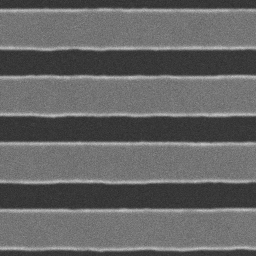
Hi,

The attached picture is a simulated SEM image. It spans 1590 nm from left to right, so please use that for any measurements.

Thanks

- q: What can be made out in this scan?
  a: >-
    lines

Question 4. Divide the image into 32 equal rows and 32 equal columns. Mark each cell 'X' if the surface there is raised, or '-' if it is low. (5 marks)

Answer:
--------------------------------
XXXXXXXXXXXXXXXXXXXXXXXXXXXXXXXX
XXXXXXXXXXXXXXXXXXXXXXXXXXXXXXXX
XXXXXXXXXXXXXXXXXXXXXXXXXXXXXXXX
XXXXXXXXXXXXXXXXXXXXXXXXXXXXXXXX
XXXXXXXXXXXXXXXXXXXXXXXXXXXXXXXX
--------------------------------
--------------------------------
--------------------------------
---XXXX--XXX-----X--XX-----XXXXX
XXXXXXXXXXXXXXXXXXXXXXXXXXXXXXXX
XXXXXXXXXXXXXXXXXXXXXXXXXXXXXXXX
XXXXXXXXXXXXXXXXXXXXXXXXXXXXXXXX
XXXXXXXXXXXXXXXXXXXXXXXXXXXXXXXX
----XXXX---XX---XXX--XXXXXXXX---
--------------------------------
--------------------------------
--------------------------------
XXXXXXXXXXXXXXXXXXXXXXXXXXXXXXXX
XXXXXXXXXXXXXXXXXXXXXXXXXXXXXXXX
XXXXXXXXXXXXXXXXXXXXXXXXXXXXXXXX
XXXXXXXXXXXXXXXXXXXXXXXXXXXXXXXX
XXXXXXXXXXXXXXXXXXXXXXXXXXXXXXXX
--------------------------------
--------------------------------
--------------------------------
XXXXXXXXXXXXXXXXXXXXXXXXXXXXXXXX
XXXXXXXXXXXXXXXXXXXXXXXXXXXXXXXX
XXXXXXXXXXXXXXXXXXXXXXXXXXXXXXXX
XXXXXXXXXXXXXXXXXXXXXXXXXXXXXXXX
XXXXXXXXXXXXXXXXXXXXXXXXXXXXXXXX
--------------------------------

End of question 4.